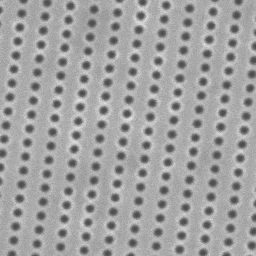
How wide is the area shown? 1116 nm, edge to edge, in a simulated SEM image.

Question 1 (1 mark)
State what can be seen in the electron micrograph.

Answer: a regular array of holes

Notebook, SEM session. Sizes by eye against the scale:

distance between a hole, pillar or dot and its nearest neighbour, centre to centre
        61.1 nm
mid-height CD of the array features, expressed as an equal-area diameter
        39.3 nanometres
